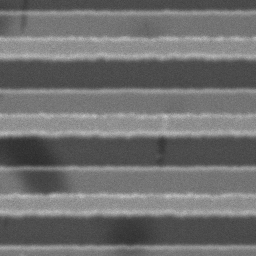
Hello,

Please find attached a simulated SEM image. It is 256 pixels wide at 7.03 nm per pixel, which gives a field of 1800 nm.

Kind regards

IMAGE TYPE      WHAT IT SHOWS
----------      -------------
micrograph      lines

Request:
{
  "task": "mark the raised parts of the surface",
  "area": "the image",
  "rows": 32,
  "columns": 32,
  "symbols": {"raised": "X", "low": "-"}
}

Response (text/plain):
--------------------------------
------X--XXX-X--X-X-XX--XXXXXXXX
XXXXXXXXXXXXXXXXXXXXXXXXXXXXXXXX
XXXXXXXXXXXXXXXXXXXXXXXXXXXXXXXX
XXXXXXXXXXXXXXXXXXXXXXXXXXXXXXXX
XXXXXXXXXXXXXXXXXXXXXXXXXXXXXXXX
XXXXXXXXXXXXXXXXXXXXXXXXXXXXXXXX
--------------------------------
--------------------------------
--------------------------------
--------------------------------
XXXXXXXXXXXXXXXXXXXXXXXXXXXXXXXX
XXXXXXXXXXXXXXXXXXXXXXXXXXXXXXXX
XXXXXXXXXXXXXXXXXXXXXXXXXXXXXXXX
XXXXXXXXXXXXXXXXXXXXXXXXXXXXXXXX
XXXXXXXXXXXXXXXXXXXXXXXXXXXXXXXX
XXXXXXXXXXXXXXXXXXXXXXXXXXXXXXXX
--------------------------------
--------------------------------
--------------------------------
--------------------------------
XXXXXXXXXXXXXXXXXXXXXXXXXXXXXXXX
XXXXXXXXXXXXXXXXXXXXXXXXXXXXXXXX
XXXXXXXXXXXXXXXXXXXXXXXXXXXXXXXX
XXXXXXXXXXXXXXXXXXXXXXXXXXXXXXXX
XXXXXXXXXXXXXXXXXXXXXXXXXXXXXXXX
XXXXXXXXXXXXXXXXXXXXXXXXXXXXXXXX
--------------------------------
--------------------------------
--------------------------------
--------------------------------
XXXXXXXXXXXXXXXXXXXXXXXXXXXXXXXX